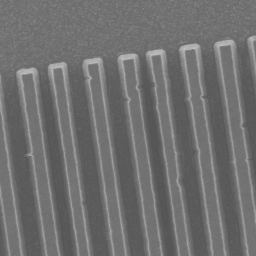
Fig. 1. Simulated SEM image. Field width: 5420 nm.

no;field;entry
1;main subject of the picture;parallel lines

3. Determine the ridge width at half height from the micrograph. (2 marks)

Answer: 0.346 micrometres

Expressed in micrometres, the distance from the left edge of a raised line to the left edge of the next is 0.706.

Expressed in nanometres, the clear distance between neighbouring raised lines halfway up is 401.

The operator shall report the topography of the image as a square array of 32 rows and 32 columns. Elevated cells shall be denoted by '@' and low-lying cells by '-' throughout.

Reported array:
--------------------------------
--------------------------------
--------------------------------
--------------------------------
--------------------------------
----------------------------@--@
-----------------------@@--@@--@
---------------@@--@@--@@--@@---
------@@---@@--@@--@@--@@--@@@--
--@@--@@---@@--@@--@@--@@---@@--
--@@@-@@---@@--@@--@@--@@---@@--
---@@--@---@@---@@-@@--@@@--@@--
---@@--@@--@@---@@-@@---@@--@@--
---@@--@@--@@---@@-@@---@@--@@--
@--@@--@@---@---@@--@@--@@--@@--
@--@@--@@---@@--@@--@@--@@--@@--
@--@@@-@@---@@--@@--@@--@@---@@-
@---@@-@@---@@--@@--@@--@@---@@-
@---@@--@@--@@---@@-@@--@@@--@@-
@---@@--@@--@@---@@-@@---@@--@@-
@---@@--@@--@@---@@--@---@@--@@-
@---@@--@@---@@--@@--@---@@--@@-
@@--@@--@@---@@--@@--@---@@--@@@
@@--@@--@@---@@--@@--@@--@@---@@
@@--@@@-@@---@@--@@--@@--@@---@@
@@---@@--@---@@---@@-@@--@@---@@
@@---@@--@@--@@---@@-@@---@@--@@
@@---@@--@@--@@---@@-@@---@@--@@
@@@--@@--@@---@---@@--@---@@--@@
-@@--@@--@@---@@--@@--@@--@@--@@
-@@--@@--@@---@@--@@--@@--@@---@
-@@---@@-@@---@@--@@--@@--@@---@